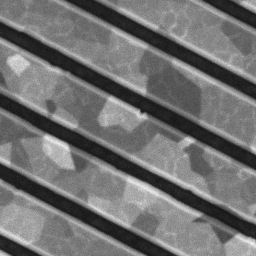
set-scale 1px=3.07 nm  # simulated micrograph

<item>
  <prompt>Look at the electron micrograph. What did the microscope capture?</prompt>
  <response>one or a few lines or trenches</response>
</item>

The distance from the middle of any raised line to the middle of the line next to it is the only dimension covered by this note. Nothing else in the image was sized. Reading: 62.7 px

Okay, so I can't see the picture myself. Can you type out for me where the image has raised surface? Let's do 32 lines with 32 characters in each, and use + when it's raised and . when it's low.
++++++++.....+++++++++++++....++
++++++++++.....++++++++++++.....
++++++++++++.....++++++++++++...
..++++++++++++.....++++++++++++.
....++++++++++++.....+++++++++++
+.....++++++++++++.....+++++++++
+++.....++++++++++++.....+++++++
+++++.....++++++++++++.....+++++
+++++++.....++++++++++++.....+++
+++++++++.....++++++++++++.....+
+++++++++++....+++++++++++++....
+++++++++++++.....+++++++++++...
..+++++++++++++....++++++++++++.
....+++++++++++++....+++++++++++
++....+++++++++++++....+++++++++
+++.....++++++++++++.....+++++++
+++++.....++++++++++++.....+++++
+++++++.....++++++++++++.....+++
+++++++++.....++++++++++++.....+
+++++++++++.....++++++++++++....
.++++++++++++.....++++++++++++..
...++++++++++++....+++++++++++++
....+++++++++++++....+++++++++++
++....+++++++++++++.....++++++++
++++....+++++++++++++....+++++++
++++++....++++++++++++.....+++++
+++++++.....++++++++++++.....+++
+++++++++.....+++++++++++++....+
+++++++++++.....++++++++++++....
.++++++++++++.....++++++++++++..
...++++++++++++.....++++++++++++
.....++++++++++++.....++++++++++